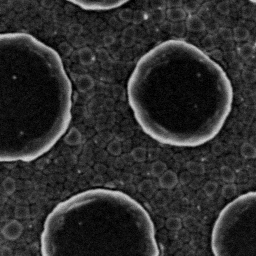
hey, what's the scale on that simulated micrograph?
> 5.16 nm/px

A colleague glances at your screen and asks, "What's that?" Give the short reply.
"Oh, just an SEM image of raised bodies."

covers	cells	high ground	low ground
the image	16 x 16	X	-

------X---------
----------------
XX--------------
XXXX-----XXXX---
XXXX----XXXXXX--
XXXX----XXXXXX--
XXXX----XXXXXX--
XXXX-----XXXXX--
XXXX------XXX---
XXX-------------
----------------
----------------
----XXXX-------X
---XXXXXX-----XX
---XXXXXXX---XXX
---XXXXXXX---XXX